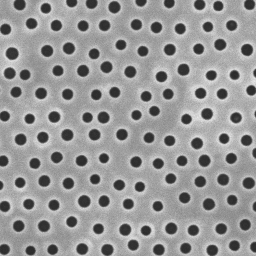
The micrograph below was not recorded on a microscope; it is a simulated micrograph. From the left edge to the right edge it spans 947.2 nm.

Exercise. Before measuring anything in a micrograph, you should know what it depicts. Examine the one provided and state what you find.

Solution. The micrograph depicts a regular array of holes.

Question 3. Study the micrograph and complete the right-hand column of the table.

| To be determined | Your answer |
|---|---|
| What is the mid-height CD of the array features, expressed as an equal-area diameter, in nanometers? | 42.9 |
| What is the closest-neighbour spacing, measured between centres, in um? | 0.0793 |